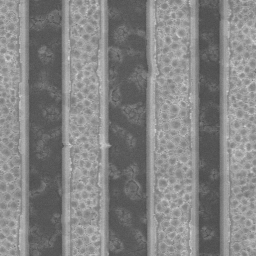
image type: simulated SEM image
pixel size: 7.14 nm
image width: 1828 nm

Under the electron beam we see one or a few lines or trenches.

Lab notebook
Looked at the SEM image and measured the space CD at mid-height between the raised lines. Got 0.311 µm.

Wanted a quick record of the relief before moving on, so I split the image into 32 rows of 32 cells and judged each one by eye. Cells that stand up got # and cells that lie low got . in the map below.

###.....#####......#####....####
###.....#####......#####....####
###.....#####......#####....####
###.....#####......#####....####
###.....#####......#####....####
###.....#####......#####....####
###.....#####......#####....####
###.....#####......#####....####
###.....#####......#####....####
###.....#####......#####....####
###.....#####......#####....####
###.....#####......#####....####
###.....#####......#####....####
###.....#####......#####....####
###.....#####......#####....####
###.....#####......#####....####
###.....#####......#####....####
###.....#####......#####....####
###.....#####......#####....####
###.....#####......#####....####
###.....#####......#####....####
###.....#####......#####....####
###.....#####......#####....####
###.....#####......#####....####
###.....#####......#####....####
###.....#####......#####....####
###.....#####......#####....####
###.....#####......#####....####
###.....#####......#####....####
###.....#####......#####....####
###.....#####......#####....####
###.....#####......#####....####